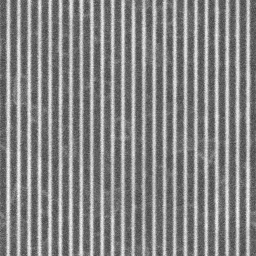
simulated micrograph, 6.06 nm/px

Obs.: parallel lines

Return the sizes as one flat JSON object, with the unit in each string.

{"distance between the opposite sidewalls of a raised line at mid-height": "12.1 nm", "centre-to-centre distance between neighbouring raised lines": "0.0632 µm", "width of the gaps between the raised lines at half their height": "51.5 nm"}